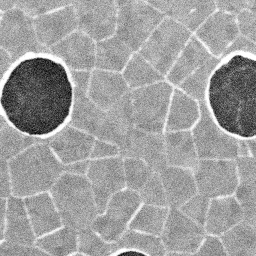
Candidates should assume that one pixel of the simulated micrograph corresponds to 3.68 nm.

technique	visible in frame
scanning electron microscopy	holes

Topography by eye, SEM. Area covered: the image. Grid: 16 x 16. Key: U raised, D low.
UUUUUUUUUUUUUUUU
UUUUUUUUUUUUUUUU
UUUUUUUUUUUUUUUU
UUUUUUUUUUUUUUUU
UDDDUUUUUUUUUDDD
DDDDUUUUUUUUUDDD
DDDDUUUUUUUUUDDD
UDDDUUUUUUUUUDDD
UUUUUUUUUUUUUUUD
UUUUUUUUUUUUUUUU
UUUUUUUUUUUUUUUU
UUUUUUUUUUUUUUUU
UUUUUUUUUUUUUUUU
UUUUUUUUUUUUUUUU
UUUUUUUUUUUUUUUU
UUUUUUUUUUUUUUUU